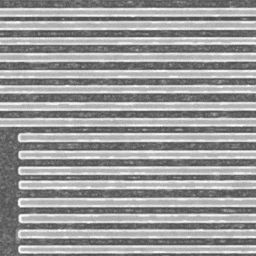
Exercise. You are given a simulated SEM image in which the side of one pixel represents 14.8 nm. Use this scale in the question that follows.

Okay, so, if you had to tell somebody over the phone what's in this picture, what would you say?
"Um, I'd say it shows parallel lines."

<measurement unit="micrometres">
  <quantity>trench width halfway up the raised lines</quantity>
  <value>0.132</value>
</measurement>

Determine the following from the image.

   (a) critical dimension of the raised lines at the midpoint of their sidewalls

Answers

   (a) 106 nm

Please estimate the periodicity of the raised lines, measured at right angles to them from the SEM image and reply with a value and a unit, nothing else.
0.234 µm